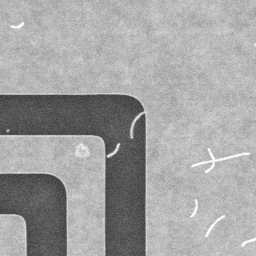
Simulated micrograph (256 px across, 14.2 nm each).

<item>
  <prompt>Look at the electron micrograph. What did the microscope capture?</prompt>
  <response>groups of lines, slits or small figures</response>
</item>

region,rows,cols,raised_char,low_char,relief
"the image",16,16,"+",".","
++++++++++++++++
++++++++++++++++
++++++++++++++++
++++++++++++++++
++++++++++++++++
++++++++++++++++
.........+++++++
.........+++++++
++++++...+++++++
+++++++..+++++++
+++++++..+++++++
....+++..+++++++
....+++..+++++++
+...+++..+++++++
++..+++..+++++++
++..+++..+++++++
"